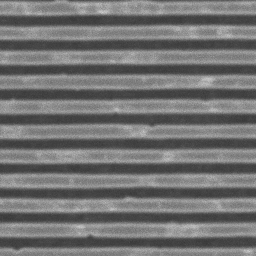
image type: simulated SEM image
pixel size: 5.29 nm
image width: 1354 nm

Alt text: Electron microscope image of parallel lines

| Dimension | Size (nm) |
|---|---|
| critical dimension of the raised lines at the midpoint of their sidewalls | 72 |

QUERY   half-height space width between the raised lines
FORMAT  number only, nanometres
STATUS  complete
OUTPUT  58.1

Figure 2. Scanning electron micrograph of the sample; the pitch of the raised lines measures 130 nm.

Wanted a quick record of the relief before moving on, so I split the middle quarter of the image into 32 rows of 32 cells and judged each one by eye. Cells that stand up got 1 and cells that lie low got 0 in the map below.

00000000000000000000000000000000
00000000000000000000000000000000
00000000000000000000000000000000
11111111111111111111111111111111
11111111111111111111111111111111
11111111111111111111111111111111
00000000000000000000000000000000
00000000000000000000000000000000
00000000000000000000000000000000
11111111111111111111111111111111
11111111111111111111111111111111
11111111111111111111111111111111
00000000000000000000000000000000
00000000000000000000000000000000
00000000000000000000000000000000
11111111111111111111101111111111
11111111111111111111111111111111
11111111111111111111111111111111
11111111111110000011111111000000
00000000000000000000000000000000
00000000000000000000000000000000
11111111111111100000000000000110
11111111111111111111111111111111
11111111111111111111111111111111
11111111111111111111111111111110
00000000000000000000000000000000
00000000000000000000000000000000
00000000000000000000000000000000
11111111111111111111111111111111
11111111111111111111111111111111
11111111111111111111111111111111
00000000000000000000000000000000